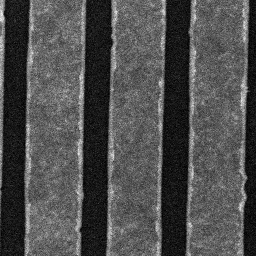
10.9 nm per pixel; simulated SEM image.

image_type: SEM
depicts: one or a few lines or trenches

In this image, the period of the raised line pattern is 887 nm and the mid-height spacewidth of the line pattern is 307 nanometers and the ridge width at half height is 582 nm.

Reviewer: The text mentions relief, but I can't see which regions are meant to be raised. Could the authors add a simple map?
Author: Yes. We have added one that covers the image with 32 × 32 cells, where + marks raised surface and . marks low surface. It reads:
....+++++++...+++++++...+++++++.
....+++++++...+++++++...+++++++.
....++++++....+++++++...+++++++.
....++++++....+++++++...+++++++.
....++++++....+++++++...+++++++.
....++++++....++++++....+++++++.
....++++++....++++++....+++++++.
....++++++....++++++....+++++++.
....++++++....++++++....+++++++.
....++++++....++++++....+++++++.
....++++++....++++++....+++++++.
....++++++....++++++....+++++++.
...+++++++....++++++....+++++++.
...+++++++....++++++....++++++..
...+++++++....++++++....++++++..
...+++++++....++++++....++++++..
...+++++++....++++++....++++++..
...+++++++....++++++....++++++..
...+++++++....++++++....++++++..
...+++++++....++++++....++++++..
...+++++++....++++++....++++++..
...+++++++....++++++....++++++..
...+++++++....++++++....+++++++.
...+++++++....++++++....++++++..
...+++++++....++++++....+++++++.
...+++++++....++++++....++++++..
...+++++++....++++++....++++++..
...+++++++....++++++....++++++..
...+++++++....++++++....++++++..
...+++++++....++++++....++++++..
...+++++++....++++++....++++++..
...+++++++....++++++....++++++..